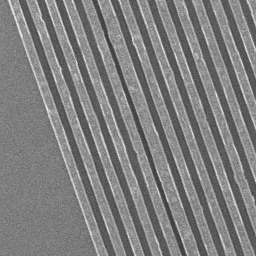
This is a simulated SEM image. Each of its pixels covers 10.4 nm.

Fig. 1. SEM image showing parallel lines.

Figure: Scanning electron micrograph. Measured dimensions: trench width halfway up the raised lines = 79.6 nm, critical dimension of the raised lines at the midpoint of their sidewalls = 99.2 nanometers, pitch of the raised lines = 180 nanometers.